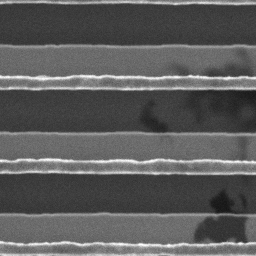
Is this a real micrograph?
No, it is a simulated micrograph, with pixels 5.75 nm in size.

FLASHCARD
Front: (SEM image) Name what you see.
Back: lines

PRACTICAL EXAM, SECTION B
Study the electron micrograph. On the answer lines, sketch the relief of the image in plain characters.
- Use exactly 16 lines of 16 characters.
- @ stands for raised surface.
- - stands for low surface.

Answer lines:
----------------
----------------
----------------
@@@@@@@@@@@@@@@@
@@@@@@@@@@@@@@@@
@@@@@@@@@@@@@@@@
----------------
----------------
@@@@@@@@@@@@@@@@
@@@@@@@@@@@@@@@@
@@@@@@@@@@@@@@@@
----------------
----------------
@@@@@@@@@@@@@@@@
@@@@@@@@@@@@@@@@
@@@@@@@@@@@@@@@@